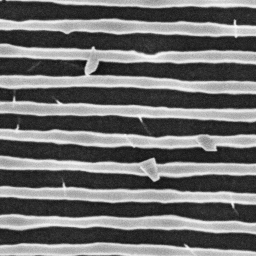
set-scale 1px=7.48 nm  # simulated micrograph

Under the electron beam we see parallel lines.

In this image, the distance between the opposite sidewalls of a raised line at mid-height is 73.8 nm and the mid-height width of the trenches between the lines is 134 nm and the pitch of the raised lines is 28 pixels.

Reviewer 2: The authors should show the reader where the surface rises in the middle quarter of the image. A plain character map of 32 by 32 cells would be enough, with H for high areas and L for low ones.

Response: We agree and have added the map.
LLLLLHHHLLLLLLLLLLLLLLLLLLLLLLLL
LLLLLHHHLLLLLLLLLLLLLLLLLLLLLLLL
LLLLLLHLLLLLLLLLLLLLLLLLLLLLLLLL
HHHHHHHHHHHHHHHHHHHHLLLLLLLLLLLL
HHHHHHHHHHHHHHHHHHHHHHHHHHHHHHHL
HLLLLLLLLLLLHHLLLHHHHHHHHHHHHHHH
LLLLLLLLLLLLLLLLLLLLLLLLLLLLLLLL
LLLLLLLLLLLLLLLLLLLLLLLLLLLLLLLL
LLLLLLLLLLLLLLLLLLLLLLLLLLLLLLLL
LLLLLLLLLLLLLLLLLLLLLLLLLLLLLLLL
HHHHHHHHLLLLLLLLLLLLLLLLLLLLLLLL
HHHHHHHHHHHHHHHHHHHHHHHHHHHHHHHH
HHHHHHHHHHHHHHHHHHHHHHHHHHHHHHHH
LLLLLLLLLLLLLLLLLLLLLLLLLLLLLLLL
LLLLLLLLLLLLLLLLLLLLLLLLLLLLLLLL
LLLLLLLLLLLLLLLLLLLLLLLLLLLLLLLL
LLLLLLLLLLLLLLLLLLLLLLLLLLLLLLLL
HHHHHHHHHLLLLLLLLLLLLLLLLLLLLLLL
HHHHHHHHHHHHHHHHHHHHHLLLHHHHLLHH
HHHHHHHHHHHHHHHHHHHHHHHHHHHHHHHH
LLLLLLLLLLLLHLLLLHHHHHHHHHHHHHHH
LLLLLLLLLLLLLLLLLLLLLLLLLLLLLLLL
LLLLLLLLLLLLLLLLLLLLLLLLLLLLLLLL
LLLLLLLLLLLLLLLLLLLLLLLLLLLLLLLL
LLLLLLLLLLLLLLLLLLLLHHHLLLLLLLLL
HHHHHHHHHHHHHHHHHHHHHHHHHHHHHHHH
LLLLHHHHHHHHHHHHHHHHHHHHHHHHHHHH
LLLLLLLLLLLLLLLLLLHHHHHHHHHHHHHH
LLLLLLLLLLLLLLLLLLLLLLHHLLLLLLLL
LLLLLLLLLLLLLLLLLLLLLLLLLLLLLLLL
LLLLLLLLLLLLLLLLLLLLLLLLLLLLLLLL
HHHHHHLLLLLLLLLLLLLLLLLLLLLLLLLL